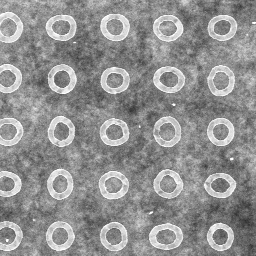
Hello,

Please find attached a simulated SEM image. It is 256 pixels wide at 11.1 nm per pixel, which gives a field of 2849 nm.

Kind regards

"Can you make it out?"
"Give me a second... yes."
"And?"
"a regular array of ring-shaped raised bodies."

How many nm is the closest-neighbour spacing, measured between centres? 574